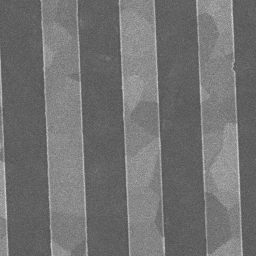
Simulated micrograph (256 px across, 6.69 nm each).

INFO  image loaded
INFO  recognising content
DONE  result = one or a few lines or trenches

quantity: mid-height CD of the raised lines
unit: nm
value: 234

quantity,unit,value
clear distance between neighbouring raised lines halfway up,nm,287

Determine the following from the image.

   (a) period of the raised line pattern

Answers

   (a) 0.518 micrometres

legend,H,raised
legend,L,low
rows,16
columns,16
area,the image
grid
LLLHHLLHHHLLHHLL
LLLHHLLLHHLLHHHL
LLLHHLLLHHLLHHHL
LLLHHLLLHHLLHHHL
LLLHHLLLHHLLHHHL
LLLHHLLLHHLLLHHL
LLLHHLLLHHLLLHHL
LLLHHLLLHHLLLHHL
LLLHHLLLHHLLLHHL
LLLHHLLLHHLLLHHL
LLLHHLLLHHLLLHHL
LLLHHLLLHHLLLHHL
LLLHHLLLHHLLLHHL
LLLHHLLLHHLLLHHL
LLLHHLLLHHLLLHHL
LLLHHLLLHHLLLHHL